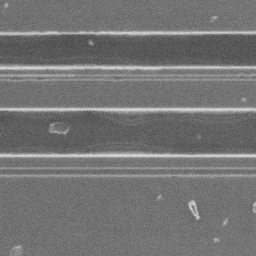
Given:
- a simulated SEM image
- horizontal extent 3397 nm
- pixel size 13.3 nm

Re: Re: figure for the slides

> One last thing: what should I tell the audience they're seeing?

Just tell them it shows lines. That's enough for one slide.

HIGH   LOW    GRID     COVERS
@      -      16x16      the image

@@@@@@@@@@@@@@@@
@@@@@@@@@@@@@@@@
----------------
----------------
@@@@@@@@@@@@@@@@
@@@@@@@@@@@@@@@@
@@@@@@@@@@@@@@@@
----------------
----------------
----------------
@@@@@@@@@@@@@@@@
@@@@@@@@@@@@@@@@
@@@@@@@@@@@@@@@@
@@@@@@@@@@@@@@@@
@@@@@@@@@@@@@@@@
@@@@@@@@@@@@@@@@